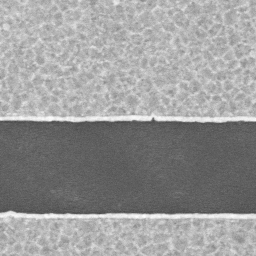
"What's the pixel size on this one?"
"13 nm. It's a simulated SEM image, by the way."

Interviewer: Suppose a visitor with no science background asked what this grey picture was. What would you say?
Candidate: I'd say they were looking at one or a few lines or trenches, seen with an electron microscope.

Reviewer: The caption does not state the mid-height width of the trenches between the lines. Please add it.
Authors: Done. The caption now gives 1270 nanometres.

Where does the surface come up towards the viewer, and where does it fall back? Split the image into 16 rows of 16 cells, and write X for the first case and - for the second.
XXXXXXXXXXXXXXXX
XXXXXXXXXXXXXXXX
XXXXXXXXXXXXXXXX
XXXXXXXXXXXXXXXX
XXXXXXXXXXXXXXXX
XXXXXXXXXXXXXXXX
XXXXXXXXXXXXXXXX
----------------
----------------
----------------
----------------
----------------
----------------
XX---------XX---
XXXXXXXXXXXXXXXX
XXXXXXXXXXXXXXXX